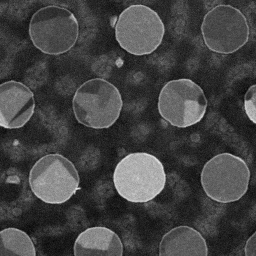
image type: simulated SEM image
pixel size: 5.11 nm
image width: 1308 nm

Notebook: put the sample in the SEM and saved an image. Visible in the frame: a regular array of raised bodies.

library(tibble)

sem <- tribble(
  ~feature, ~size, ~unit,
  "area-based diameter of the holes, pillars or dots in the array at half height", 249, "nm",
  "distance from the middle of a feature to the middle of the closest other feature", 0.434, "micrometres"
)